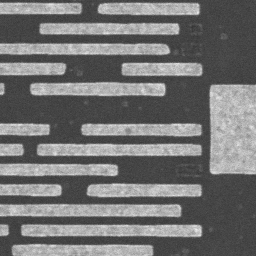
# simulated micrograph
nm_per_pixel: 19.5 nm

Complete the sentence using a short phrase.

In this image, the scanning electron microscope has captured wiring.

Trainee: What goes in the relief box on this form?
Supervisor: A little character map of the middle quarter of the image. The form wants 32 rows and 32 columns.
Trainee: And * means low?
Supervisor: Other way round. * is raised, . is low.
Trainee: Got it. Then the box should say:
...............*****************
...............*****************
...............*****************
................................
................................
*************************.......
*************************.......
*************************.......
................................
................................
................................
................................
................................
................................
................................
.....***************************
.....***************************
.....***************************
................................
................................
********************************
********************************
********************************
................................
................................
*************...............****
*************...............****
*************...............****
................................
................................
......**************************
......**************************